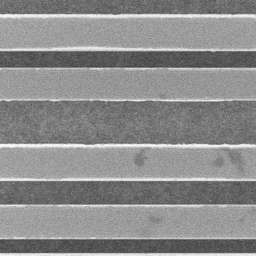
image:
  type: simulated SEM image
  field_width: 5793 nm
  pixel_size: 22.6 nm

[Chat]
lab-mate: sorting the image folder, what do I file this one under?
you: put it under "lines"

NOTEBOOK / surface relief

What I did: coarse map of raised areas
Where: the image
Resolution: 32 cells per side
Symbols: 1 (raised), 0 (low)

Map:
00000000000000000000000000000000
00000000000000000000000000000000
11111111111111111111111111111111
11111111111111111111111111111111
11111111111111111111111111111111
11111111111111111111111111111111
00000000000000000000000000000000
00000000000000000000000000000000
00000000000000000000000000000000
11111111111111111111111111111111
11111111111111111111111111111111
11111111111111111111111111111111
11000010000000111100111111110000
00000000000000000000000000000000
00000000000000000000000000000000
00000000000000000000000000000000
00000000000000000000000000000000
00000000000000000000000000000000
11111111111111111111111111111111
11111111111111111111111111111111
11111111111111111111111111111111
11111111111111111111111111111111
00111111100000001111000000111111
00000000000000000000000000000000
00000000000000000000000000000000
00000000000000000000000000000000
11111111111111111111111111111111
11111111111111111111111111111111
11111111111111111111111111111111
11111111111111111111111111111111
00000000000000000000000000000000
00000000000000000000000000000000